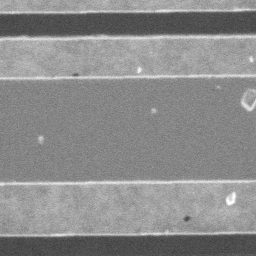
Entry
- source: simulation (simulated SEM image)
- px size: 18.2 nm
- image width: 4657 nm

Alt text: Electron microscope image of lines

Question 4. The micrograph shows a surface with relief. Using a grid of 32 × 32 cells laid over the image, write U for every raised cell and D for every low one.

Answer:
DDDDDDDDDDDDDDDDDDDDDDDDDDDDDDDD
DDDDDDDDDDUUUUUUUUUUUUUUUUUUUUUU
UUUUUUUUUUUUUUUUUUUUUUUUUUUUUUUU
UUUUUUUUUUUUUUUUUUUUUUUUUUUUUUUU
UUUUUUUUUUUUUUUUUUUUUUUUUUUUUUUU
DDDDDDDDDDDDDDDDDDDDDDDDDDDDDDDD
DDDDDDDDDDDDDDDDDDDDDDDDDDDDDDDD
DDDDDDDDDDDDDDDDDDDDDDDDDDDDDDDD
DDDDDDDDDDDDDDDDDDDDDDDDDDDDDDDD
DDDDDDDDDDDDDDDDDDDDDDDDUUUDUUUU
UUUUUUUUUUUUUUUUUUUUUUUUUUUUUUUU
UUUUUUUUUUUUUUUUUUUUUUUUUUUUUUUU
UUUUUUUUUUUUUUUUUUUUUUUUUUUUUUUU
UUUUUUUUUUUUUUUUUUUUUUUUUUUUUUUU
UUUUUUUUUUUUUUUUUUUUUUUUUUUUUUUU
UUUUUUUUUUUUUUUUUUUUUUUUUUUUUUUU
UUUUUUUUUUUUUUUUUUUUUUUUUUUUUUUU
UUUUUUUUUUUUUUUUUUUUUUUUUUUUUUUU
UUUUUUUUUUUUUUUUUUUUUUUUUUUUUUUU
UUUUUUUUUUUUUUUUUUUUUUUUUUUUUUUU
UUUUUUUUUUUUUUUUUUUUUUUUUUUUUUUU
UUUUUUUUUUUUUUUUUUUUUUUUUUUUUUUU
UUUUUUUUUUUUUUUUUUUUUUUUUUUUUUUU
DDDDDDDDDDDDDDDDDDDDDDDDDDDDDDDD
DDDDDDDDDDDDDDDDDDDDDDDDDDDDDDDD
DDDDDDDDDDDDDDDDDDDDDDDDDDDDDDDD
DDDDDDDDDDDDDDDDDDDDDDDDDDDDDDDD
DDDDDDDDDDDDDDDDDDDDDDDDDDDDDDDD
DDDDDDDDDDDDDDDDDDDDDDDDDDDDDDDD
UUUUUUUUUUUUUUUUUUUUUUUUUUUUUUUU
UUUUUUUUUUUUUUUUUUUUUUUUUUUUUUUU
UUUUUUUUUUUUUUUUUUUUUUUUUUUUUUUU